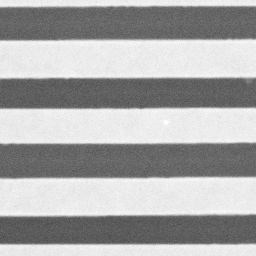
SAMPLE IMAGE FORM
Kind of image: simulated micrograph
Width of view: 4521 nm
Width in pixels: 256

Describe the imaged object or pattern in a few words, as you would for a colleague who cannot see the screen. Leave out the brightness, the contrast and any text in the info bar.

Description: lines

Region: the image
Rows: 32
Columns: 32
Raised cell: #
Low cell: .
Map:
################################
................................
................................
................................
................................
################################
################################
################################
################################
################################
................................
................................
................................
................................
################################
################################
################################
################################
................................
................................
................................
................................
################################
################################
################################
################################
################################
................................
................................
................................
................................
################################